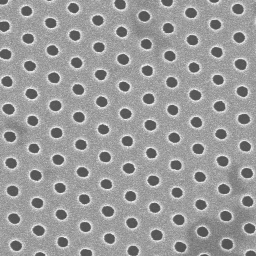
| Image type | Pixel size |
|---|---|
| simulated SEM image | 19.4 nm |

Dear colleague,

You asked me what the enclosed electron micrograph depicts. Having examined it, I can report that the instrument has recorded a regular array of holes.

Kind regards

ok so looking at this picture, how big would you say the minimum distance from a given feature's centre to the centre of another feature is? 517 nanometres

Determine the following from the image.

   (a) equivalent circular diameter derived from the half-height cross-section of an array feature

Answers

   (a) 11.3 pixels